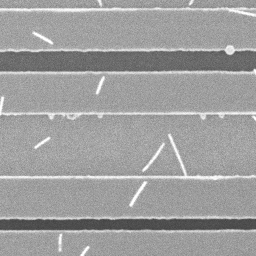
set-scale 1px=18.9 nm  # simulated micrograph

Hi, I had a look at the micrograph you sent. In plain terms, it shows lines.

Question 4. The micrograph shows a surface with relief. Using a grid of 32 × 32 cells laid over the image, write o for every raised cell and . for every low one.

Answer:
................................
oooooooooooooooooooooooooooooooo
oooooooooooooooooooooooooooooooo
oooooooooooooooooooooooooooooooo
oooooooooooooooooooooooooooooooo
oooooooooooooooooooooooooooooooo
............................o...
................................
................................
oooooooooooooooooooooooooooooooo
oooooooooooooooooooooooooooooooo
oooooooooooooooooooooooooooooooo
oooooooooooooooooooooooooooooooo
oooooooooooooooooooooooooooooooo
................................
................................
................................
................................
................................
................................
................................
................................
oooooooooooooooooooooooooooooooo
oooooooooooooooooooooooooooooooo
oooooooooooooooooooooooooooooooo
oooooooooooooooooooooooooooooooo
oooooooooooooooooooooooooooooooo
................................
................................
oooooooooooooooooooooooooooooooo
oooooooooooooooooooooooooooooooo
oooooooooooooooooooooooooooooooo